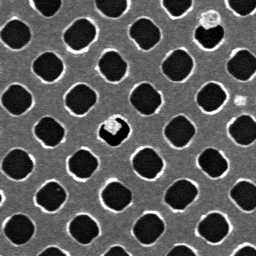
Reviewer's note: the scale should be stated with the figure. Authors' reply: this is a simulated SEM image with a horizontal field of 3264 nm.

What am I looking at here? a regular array of holes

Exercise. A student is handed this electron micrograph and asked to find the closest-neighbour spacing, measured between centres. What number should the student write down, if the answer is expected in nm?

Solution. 576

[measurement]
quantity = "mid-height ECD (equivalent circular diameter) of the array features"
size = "388 nanometers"